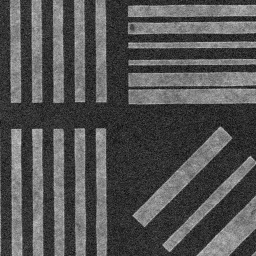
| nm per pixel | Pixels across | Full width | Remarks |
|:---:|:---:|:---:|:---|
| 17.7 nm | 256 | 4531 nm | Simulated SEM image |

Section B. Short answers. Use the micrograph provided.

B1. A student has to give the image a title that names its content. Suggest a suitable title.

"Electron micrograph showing groups of lines, slits or small figures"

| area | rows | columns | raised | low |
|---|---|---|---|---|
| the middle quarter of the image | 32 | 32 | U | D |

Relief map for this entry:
DDDUUDDDUUDDDDDDDDDDDDDDDDDDDDDD
DDDUUDDDUUDDDDDDDDDDDDDDDDDDDDDD
DDDUUDDDUUDDDDDDUUUUUUUUUUUUUUUU
DDDUUDDDUUDDDDDDUUUUUUUUUUUUUUUU
DDDUUDDDUUDDDDDDUUUUUUUUUUUUUUUU
DDDUUDDDUUDDDDDDDDDDDDDDDDDDDDDD
DDDUUDDDUUDDDDDDDDDDDDDDDDDDDDDD
DDDUUDDDUUDDDDDDUUUUUUUUUUUUUUUU
DDDUUDDDUUDDDDDDUUUUUUUUUUUUUUUU
DDDDDDDDDDDDDDDDUUUUUUUUUUUUUUUU
DDDDDDDDDDDDDDDDDDDDDDDDDDDDDDDD
DDDDDDDDDDDDDDDDDDDDDDDDDDDDDDDD
DDDDDDDDDDDDDDDDDDDDDDDDDDDDDDDD
DDDDDDDDDDDDDDDDDDDDDDDDDDDDDDDD
DDDDDDDDDDDDDDDDDDDDDDDDDDDDDDDD
DDDDDDDDDDDDDDDDDDDDDDDDDDDDDDDD
DDDUUDDDUUDDDDDDDDDDDDDDDDDDDDDD
DDDUUDDDUUDDDDDDDDDDDDDDDDDDDDDD
DDDUUDDDUUDDDDDDDDDDDDDDDDDDDDDD
DDDUUDDDUUDDDDDDDDDDDDDDDDDDDDDD
DDDUUDDDUUDDDDDDDDDDDDDDDDDDDDDD
DDDUUDDDUUDDDDDDDDDDDDDDDDDDDDDD
DDDUUDDDUUDDDDDDDDDDDDDDDDDDDDDD
DDDUUDDDUUDDDDDDDDDDDDDDDDDDDDDU
DDDUUDDDUUDDDDDDDDDDDDDDDDDDDDUU
DDDUUDDDUUDDDDDDDDDDDDDDDDDDDUUU
DDDUUDDDUUDDDDDDDDDDDDDDDDDDDUUU
DDDUUDDDUUDDDDDDDDDDDDDDDDDUUUUU
DDDUUDDDUUDDDDDDDDDDDDDDDDUUUUUU
DDDUUDDDUUDDDDDDDDDDDDDDDDUUUUUD
DDDUUDDDUUDDDDDDDDDDDDDDUUUUUUDD
DDDUUDDDUUDDDDDDDDDDDDDUUUUUUDDD